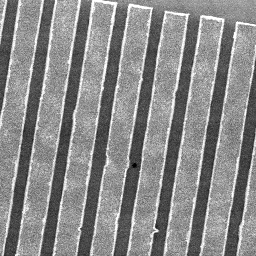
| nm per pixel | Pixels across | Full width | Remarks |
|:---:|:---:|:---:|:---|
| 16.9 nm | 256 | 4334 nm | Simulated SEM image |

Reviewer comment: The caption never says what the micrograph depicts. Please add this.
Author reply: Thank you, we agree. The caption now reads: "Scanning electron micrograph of parallel lines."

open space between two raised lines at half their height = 230 nm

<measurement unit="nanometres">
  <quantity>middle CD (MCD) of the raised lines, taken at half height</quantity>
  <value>389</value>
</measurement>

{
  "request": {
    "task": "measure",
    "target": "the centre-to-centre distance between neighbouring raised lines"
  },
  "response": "614 nanometers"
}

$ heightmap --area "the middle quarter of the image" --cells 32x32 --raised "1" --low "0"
10000111110000111111000111111000
10000111110000111111000111111000
10001111110000111110000111111000
10001111110000111110000111111000
10001111110001111110000111110000
10001111100001111110001111110000
00001111100001111110001111110000
00001111100001111100001111110001
00001111100001111100001111110001
00011111100001111100001111100001
00011111100001111100001111100001
00011111100011111100001111100001
00011111100011111100011111100001
00111111000011111100011111100011
00011111000011111100011111100011
00111111000011111000011111000011
00111111000011111000011111000011
00111111000111111000111111000011
00111111000111111000111111000011
00111111000111111000111111000111
00111110000111111000111110000111
01111110000111110000111111000111
01111110000111110000111110000111
01111110000111110000111110000111
01111110000111110000111110000111
01111110001111110001111110001111
01111100001111110001111110001111
01111100001111100001111110001111
11111100001111100001111100001111
11111100001111100001111100001111
11111100001111100001111100001111
11111100011111100011111100001111